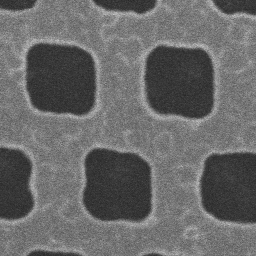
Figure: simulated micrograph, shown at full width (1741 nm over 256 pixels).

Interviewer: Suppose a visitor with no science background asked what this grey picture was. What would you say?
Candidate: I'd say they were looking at holes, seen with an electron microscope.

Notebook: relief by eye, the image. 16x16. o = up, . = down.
..oooo....oooo..
oooooooooooooooo
oooooooooooooooo
oo....ooo....ooo
oo....ooo....ooo
oo....ooo....ooo
oo....ooo....ooo
oooooooooooooooo
oooooooooooooooo
.ooooo..oooooooo
..ooo....oooo...
..ooo....ooo....
..ooo....oooo...
..oooo...oooo...
oooooooooooooooo
oooooooooooooooo